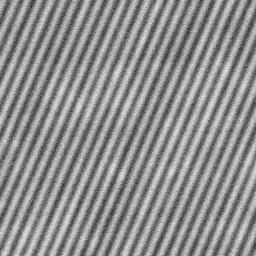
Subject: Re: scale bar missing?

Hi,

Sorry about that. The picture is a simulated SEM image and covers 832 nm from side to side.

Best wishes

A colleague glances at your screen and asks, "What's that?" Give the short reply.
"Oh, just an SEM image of parallel lines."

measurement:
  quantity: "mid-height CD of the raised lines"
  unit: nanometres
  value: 17.2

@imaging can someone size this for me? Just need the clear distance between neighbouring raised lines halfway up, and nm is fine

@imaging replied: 19.9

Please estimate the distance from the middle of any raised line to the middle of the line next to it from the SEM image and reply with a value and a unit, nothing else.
36 nanometres